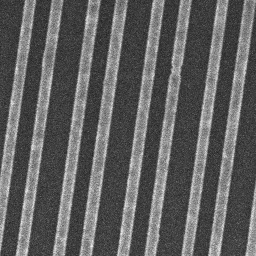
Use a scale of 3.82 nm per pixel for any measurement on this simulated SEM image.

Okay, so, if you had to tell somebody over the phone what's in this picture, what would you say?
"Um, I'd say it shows parallel lines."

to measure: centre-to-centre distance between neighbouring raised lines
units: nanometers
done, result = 120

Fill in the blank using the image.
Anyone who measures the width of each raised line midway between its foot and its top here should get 36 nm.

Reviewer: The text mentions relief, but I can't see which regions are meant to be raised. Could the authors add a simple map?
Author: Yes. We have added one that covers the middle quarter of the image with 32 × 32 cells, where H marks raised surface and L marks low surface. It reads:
LLLLHHHLLLLHHLLLLLLLHHHLLLLHHLLL
LLLLHHLLLLLHHLLLLLLLHHLLLLLHHLLL
LLLLHHLLLLLHHLLLLLLLHHLLLLLHHLLL
LLLLHHLLLLHHHLLLLLLLHHLLLLLHHLLL
LLLLHHLLLLHHHLLLLLLLHHLLLLHHHLLL
LLLHHHLLLLHHHLLLLLLLHHLLLLHHHLLL
LLLHHHLLLLHHLLLLLLLHHHLLLLHHLLLL
LLLHHHLLLLHHLLLLLLLHHHLLLLHHLLLL
LLLHHLLLLLHHLLLLLLLHHLLLLLHHLLLL
LLLHHLLLLLHHLLLLLLLHHLLLLLHHLLLL
LLLHHLLLLHHHLLLLLLLHHLLLLLHHLLLL
LLLHHLLLLHHHLLLLLLLHHLLLLLHHLLLL
LLHHHLLLLHHHLLLLLLLHHLLLLLHHLLLL
LLHHHLLLLHHLLLLLLLHHHLLLLHHLLLLL
LLHHHLLLLHHLLLLLLLHHHLLLLHHLLLLL
LLHHLLLLLHHLLLLLLLHHLLLLLHHLLLLL
LLHHLLLLLHHLLLLLLLHHLLLLLHHLLLLL
LLHHLLLLHHHLLLLLLLHHLLLLLHHLLLLL
LLHHLLLLHHHLLLLLLLHHLLLLHHHLLLLL
LHHHLLLLHHHLLLLLLLHHLLLLHHHLLLLL
LHHHLLLLHHHLLLLLLHHHLLLLHHLLLLLL
LHHHLLLLHHHLLLLLLHHHLLLLHHLLLLLL
LHHLLLLLHHLLLLLLLHHLLLLLHHLLLLLL
LHHLLLLLHHLLLLLLLHHLLLLLHHLLLLLL
LHHLLLLHHHLLLLLLLHHLLLLLHHLLLLLL
LHHLLLLHHHLLLLLLLHHLLLLHHHLLLLLL
HHHLLLLHHHLLLLLLLHHLLLLHHHLLLLLL
HHHLLLLHHHLLLLLLLHHLLLLHHLLLLLLL
HHHLLLLHHHLLLLLLHHHLLLLHHLLLLLLL
HHLLLLLHHLLLLLLLHHLLLLLHHLLLLLLL
HHLLLLLHHLLLLLLLHHLLLLLHHLLLLLLL
HHLLLLHHHLLLLLLLHHLLLLLHHLLLLLLL